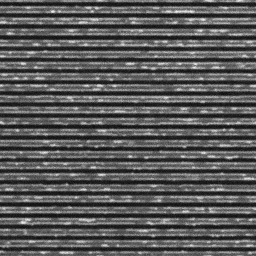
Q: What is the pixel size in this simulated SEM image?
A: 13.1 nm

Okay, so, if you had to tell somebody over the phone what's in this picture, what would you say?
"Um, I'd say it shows parallel lines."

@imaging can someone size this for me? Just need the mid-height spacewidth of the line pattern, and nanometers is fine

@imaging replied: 65.6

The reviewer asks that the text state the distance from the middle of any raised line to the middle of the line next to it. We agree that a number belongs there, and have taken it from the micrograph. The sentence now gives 0.146 micrometres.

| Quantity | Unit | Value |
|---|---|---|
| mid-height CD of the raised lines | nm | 78.8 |